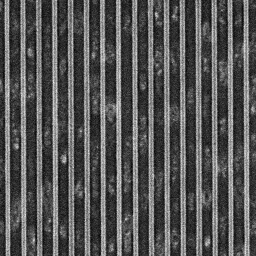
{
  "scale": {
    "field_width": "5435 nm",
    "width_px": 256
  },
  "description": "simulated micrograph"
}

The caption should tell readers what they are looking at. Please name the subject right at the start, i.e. parallel lines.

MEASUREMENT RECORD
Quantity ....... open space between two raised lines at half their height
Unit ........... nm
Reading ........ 252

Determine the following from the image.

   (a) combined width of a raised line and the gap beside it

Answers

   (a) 338 nanometers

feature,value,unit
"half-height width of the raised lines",82.3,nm